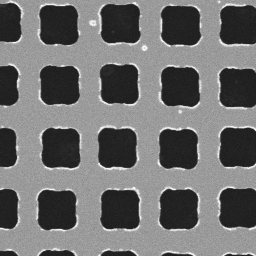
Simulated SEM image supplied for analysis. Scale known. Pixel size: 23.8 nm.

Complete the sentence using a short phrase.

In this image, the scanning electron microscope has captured a regular array of holes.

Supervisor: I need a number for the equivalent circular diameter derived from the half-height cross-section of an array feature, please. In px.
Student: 42.8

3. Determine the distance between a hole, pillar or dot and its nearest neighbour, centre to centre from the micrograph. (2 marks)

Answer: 1430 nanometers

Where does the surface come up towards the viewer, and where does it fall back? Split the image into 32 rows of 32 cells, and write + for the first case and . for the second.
..++++++++++++++++++++++++++++++
...++.....+++....+++.....+++....
...++.....+++....+++.....+++....
...++.....+++....+++.....+++....
...++.....+++.....++.....+++....
++++++...++++++++++++...+++++++.
++++++++++++++++++++++++++++++++
++++++++++++++++++++++++++++++++
..+++....++++....++++...++++++++
..+++.....+++....+++.....++.....
..+++.....+++....+++.....++.....
..+++.....+++....+++.....++.....
..+++.....+++....+++.....++.....
++++++++++++++++++++++++++++++++
++++++++++++++++++++++++++++++++
++++++++++++++++++++++++++++++++
..++++....+++....+++....++++....
..+++.....++.....+++.....+++....
..+++.....++.....+++.....+++....
..+++.....++.....+++.....++.....
..+++.....+++....+++.....+++....
++++++++++++++++++++++++++++++++
++++++++++++++++++++++++++++++++
++++++++++++++++++++++++++++++++
..+++....++++....+++.....+++....
..+++.....+++....+++.....++.....
..+++....++++....+++.....++.....
..+++.....+++....+++.....++.....
..+++....++++....++++...++++++++
++++++++++++++++++++++++++++++++
++++++++++++++++++++++++++++++++
..+++....++++...++++++++++++++++